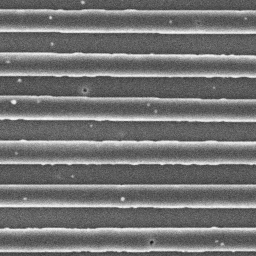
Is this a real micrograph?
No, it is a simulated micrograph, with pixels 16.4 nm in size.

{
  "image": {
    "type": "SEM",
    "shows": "lines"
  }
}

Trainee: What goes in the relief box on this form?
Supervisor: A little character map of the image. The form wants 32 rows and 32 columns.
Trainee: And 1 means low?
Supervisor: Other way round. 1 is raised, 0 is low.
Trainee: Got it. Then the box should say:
00000000000000000000000000000000
11111111111111111111111111111111
11111111111111111111111111111111
11111111111111111111111111111111
00000000000000000000000000000000
00000000000000000000000000000000
00000000000000000000000000000000
11111111111111111111111111111111
11111111111111111111111111111111
00000001111100111111111111111111
00000000000000000000000000000000
00000000000000000000000000000000
11111111111111111111111111011000
11111111111111111111111111111111
11111111111111111111111111111111
00000000000000000000000000000000
00000000000000000000000000000000
00000000000000000000000000000000
11111111111111111111111111111111
11111111111111111111111111111111
00000000000000001100000100000000
00000000000000000000000000000000
00000000000000000000000000000000
11111111111111111111111111111111
11111111111111111111111111111111
11111111111111111111111111111111
00000000000000000000000000000000
00000000000000000000000000000000
00000000000000000000000000000000
11111111111111111111111111111111
11111111111111111111111111111111
00000000000000000000000000000000